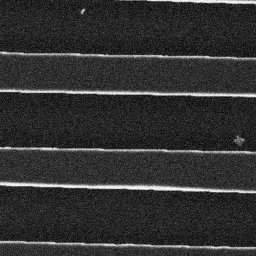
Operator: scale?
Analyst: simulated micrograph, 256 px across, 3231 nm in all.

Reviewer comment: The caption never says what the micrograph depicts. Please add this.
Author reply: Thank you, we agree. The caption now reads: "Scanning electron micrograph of lines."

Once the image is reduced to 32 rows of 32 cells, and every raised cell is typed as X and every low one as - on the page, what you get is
--------------------------------
--------------------------------
--------------------------------
--------------------------------
--------------------------------
--------------------------------
--------------------------------
XXXXXXXXXXXXXXXXXXXXXXXXXXXXXXXX
XXXXXXXXXXXXXXXXXXXXXXXXXXXXXXXX
XXXXXXXXXXXXXXXXXXXXXXXXXXXXXXXX
XXXXXXXXXXXXXXXXXXXXXXXXXXXXXXXX
-----XXXXXXXXXXXXXXXXXXXXXXXXXXX
--------------------------------
--------------------------------
--------------------------------
--------------------------------
--------------------------------
--------------------------------
XX------------------------------
XXXXXXXXXXXXXXXXXXXXXXXXXXXXXXXX
XXXXXXXXXXXXXXXXXXXXXXXXXXXXXXXX
XXXXXXXXXXXXXXXXXXXXXXXXXXXXXXXX
XXXXXXXXXXXXXXXXXXXXXXXXXXXXXXXX
----------------XXXXXXXXXXXXXXXX
--------------------------------
--------------------------------
--------------------------------
--------------------------------
--------------------------------
--------------------------------
XXXXXXXXXXX---------------------
XXXXXXXXXXXXXXXXXXXXXXXXXXXXXXXX